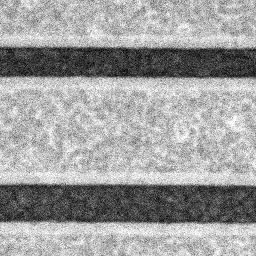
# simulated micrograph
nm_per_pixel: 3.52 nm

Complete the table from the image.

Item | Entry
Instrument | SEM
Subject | one or a few lines or trenches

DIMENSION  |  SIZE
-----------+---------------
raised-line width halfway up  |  332 nm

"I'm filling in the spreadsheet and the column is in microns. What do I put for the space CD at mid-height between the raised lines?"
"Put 0.163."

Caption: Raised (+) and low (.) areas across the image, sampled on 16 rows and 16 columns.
++++++++++++++++
++++++++++++++++
++++++++++++++++
................
................
++++++++++++++++
++++++++++++++++
++++++++++++++++
++++++++++++++++
++++++++++++++++
++++++++++++++++
................
................
................
++++++++++++++++
++++++++++++++++